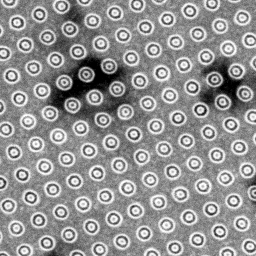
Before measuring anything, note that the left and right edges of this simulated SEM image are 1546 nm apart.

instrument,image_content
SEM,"a regular array of ring-shaped grooves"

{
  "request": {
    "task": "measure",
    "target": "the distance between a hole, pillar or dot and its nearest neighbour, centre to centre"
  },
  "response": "142 nm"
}